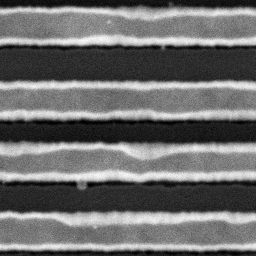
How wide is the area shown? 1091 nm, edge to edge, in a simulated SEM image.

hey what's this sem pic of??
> lines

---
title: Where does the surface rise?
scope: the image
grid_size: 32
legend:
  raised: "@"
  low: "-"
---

--------------------------------
@@@@@@@@@@@@@@@@@@@@@@@@@@@@@@@@
@@@@@@@@@@@@@@@@@@@@@@@@@@@@@@@@
@@@@@@@@@@@@@@@@@@@@@@@@@@@@@@@@
@@@@@@@@@@@@@@@@@@@@@@@@@@@@@@@@
@---@@-@@@@----@@@@-@-@@-@@@@@--
--------------------------------
--------------------------------
--------------------------------
--------------------------------
@@@@@@@@@@@@@@@@@@@@@@@@@@@@@@@@
@@@@@@@@@@@@@@@@@@@@@@@@@@@@@@@@
@@@@@@@@@@@@@@@@@@@@@@@@@@@@@@@@
@@@@@@@@@@@@@@@@@@@@@@@@@@@@@@@@
@@@@@@@@@@@@@@@@@@@@@@@@@@@@@@@@
--------------------------------
--------------------------------
--------------------------------
@@@@@@@@@@@@@@@@@@@@@@@@@@@@@@@@
@@@@@@@@@@@@@@@@@@@@@@@@@@@@@@@@
@@@@@@@@@@@@@@@@@@@@@@@@@@@@@@@@
@@@@@@@@@@@@@@@@@@@@@@@@@@@@@@@@
----------------@@--------------
--------------------------------
--------------------------------
--------------------------------
--------------------------------
@@@@@@@@@@@@@@@@@@@@@@@@@@@@@@@@
@@@@@@@@@@@@@@@@@@@@@@@@@@@@@@@@
@@@@@@@@@@@@@@@@@@@@@@@@@@@@@@@@
@@@@@@@@@@@@@@@@@@@@@@@@@@@@@@@@
--------------------------------